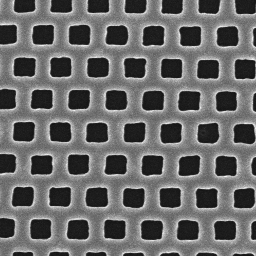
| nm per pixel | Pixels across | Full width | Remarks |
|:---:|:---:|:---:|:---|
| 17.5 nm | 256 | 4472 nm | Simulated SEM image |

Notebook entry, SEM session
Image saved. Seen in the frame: a regular array of holes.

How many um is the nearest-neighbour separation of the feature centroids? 0.639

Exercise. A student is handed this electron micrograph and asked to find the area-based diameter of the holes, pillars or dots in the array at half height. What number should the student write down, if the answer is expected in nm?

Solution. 398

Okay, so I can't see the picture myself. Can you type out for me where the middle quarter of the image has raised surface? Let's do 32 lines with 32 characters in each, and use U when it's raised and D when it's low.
DDUUUUDDDDDUUUUDDDDDUUUUDDDDDDUU
DDUUUUDDDDDUUUUDDDDDDUUUDDDDDDUU
DDUUUUDDDDDUUUUDDDDDUUUUDDDDDDUU
UUUUUUUDDDUUUUUUUUDUUUUUUDDDDUUU
UUUUUUUUUUUUUUUUUUUUUUUUUUUUUUUU
UUUUUUUUUUUUUUUUUUUUUUUUUUUUUUUU
UUDDDDUUUUUUDDDUUUUUUUUUUUUUUUUU
UDDDDDDUUUDDDDDDUUUUDDDDDUUUUDDD
UDDDDDDUUUUDDDDDUUUUDDDDDUUUUDDD
UDDDDDDUUUDDDDDDUUUDDDDDDUUUDDDD
UDDDDDUUUUDDDDDDUUUDDDDDDUUUDDDD
UUUUUUUUUUUDDDDUUUUUDDDDUUUUUDDD
UUUUUUUUUUUUUUUUUUUUUUUUUUUUUUUU
UUUUUUUUUUUUUUUUUUUUUUUUUUUUUUUU
UUUUUUUUUUUUUUUUUUUDUUUUUUUUUUUU
DDUUUUDDDDDUUUUDDDDDUUUUDDDDDUUU
DDUUUUDDDDDUUUUDDDDDUUUUDDDDDDUU
DDUUUUDDDDDUUUUDDDDDUUUUDDDDDUUU
DDUUUDDDDDDUUUUDDDDDUUUUDDDDDDUU
DUUUUUDDDDUUUUUDDDDDUUUUDDDDDUUU
UUUUUUUUUUUUUUUUUUUUUUUUUUUUUUUU
UUUUUUUUUUUUUUUUUUUUUUUUUUUUUUUU
UUUUUUUUUUUUUUUUUUUUUUUUUUUUUUUU
UDDDDDUUUUUDDDDDUUUUDDDDDUUUUDDD
UDDDDDUUUUDDDDDDUUUDDDDDDUUUUDDD
UDDDDDUUUUDDDDDDUUUDDDDDDUUUUDDD
UDDDDDUUUUDDDDDDUUUDDDDDDUUUUDDD
UUDDDUUUUUDDDDDUUUUDDDDDUUUUUDDD
UUUUUUUUUUUUUUUUUUUUUUUUUUUUUUUU
UUUUUUUUUUUUUUUUUUUUUUUUUUUUUUUU
UUUUUUUUUUUUUUUUUUUUUUUUUUUUUUUU
DDUUUUDDDDDUUUUDDDDDUUUUDDDDDUUU